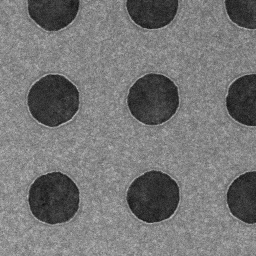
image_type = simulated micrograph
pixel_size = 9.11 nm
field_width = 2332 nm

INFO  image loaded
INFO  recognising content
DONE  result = holes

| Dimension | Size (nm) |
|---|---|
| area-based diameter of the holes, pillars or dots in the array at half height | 478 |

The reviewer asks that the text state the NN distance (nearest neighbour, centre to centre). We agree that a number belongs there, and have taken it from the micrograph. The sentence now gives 890 nanometers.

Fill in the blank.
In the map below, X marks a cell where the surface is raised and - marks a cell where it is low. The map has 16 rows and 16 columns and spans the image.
XX---XXX---XXX--
XX--XXXXX-XXXXX-
XXXXXXXXXXXXXXXX
XXXXXXXXXXXXXXXX
XXXXXXXXXXXXXXXX
XX---XXX---XXX--
XX---XXX---XXX--
XX--XXXXX-XXXXX-
XXXXXXXXXXXXXXXX
XXXXXXXXXXXXXXXX
XXXXXXXXXXXXXXXX
XX---XXX---XXX--
XX---XXX---XXX--
XX---XXXX--XXXX-
XXXXXXXXXXXXXXXX
XXXXXXXXXXXXXXXX